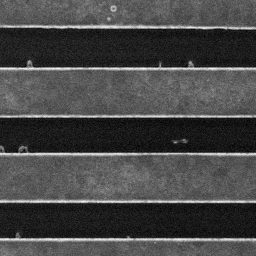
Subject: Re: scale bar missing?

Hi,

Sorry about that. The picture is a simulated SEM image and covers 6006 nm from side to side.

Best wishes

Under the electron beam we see lines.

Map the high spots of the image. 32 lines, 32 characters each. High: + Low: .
++++++++++++++++++++++++++++++++
++++++++++++++++++++++++++++++++
++++++++++++++++++++++++++++++++
.........................+...+++
................................
................................
................................
................................
................................
++++++++++++++++++++++++++++++++
++++++++++++++++++++++++++++++++
++++++++++++++++++++++++++++++++
++++++++++++++++++++++++++++++++
++++++++++++++++++++++++++++++++
++++++++++++++++++++++++++++++++
................................
................................
................................
................................
++++++++++++++++++++++++++++++++
++++++++++++++++++++++++++++++++
++++++++++++++++++++++++++++++++
++++++++++++++++++++++++++++++++
++++++++++++++++++++++++++++++++
++++++++++++++++++++++++++++++++
................................
................................
................................
................................
................................
++++++++++++++++++++++++++++++++
++++++++++++++++++++++++++++++++